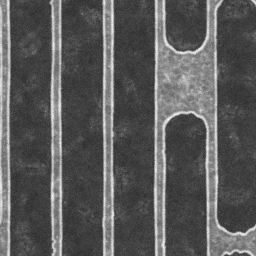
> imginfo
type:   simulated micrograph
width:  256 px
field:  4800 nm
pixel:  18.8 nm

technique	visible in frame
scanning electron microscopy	parallel lines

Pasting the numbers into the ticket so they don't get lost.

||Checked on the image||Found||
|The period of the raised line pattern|0.971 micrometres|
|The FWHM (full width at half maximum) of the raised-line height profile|0.162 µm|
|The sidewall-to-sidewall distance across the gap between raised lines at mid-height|0.806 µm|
